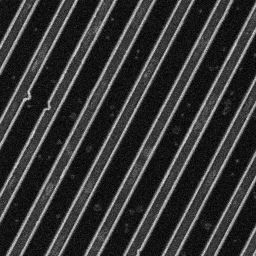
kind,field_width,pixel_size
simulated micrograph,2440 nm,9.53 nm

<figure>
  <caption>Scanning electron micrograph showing parallel lines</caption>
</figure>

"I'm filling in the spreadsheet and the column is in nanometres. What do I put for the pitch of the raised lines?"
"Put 329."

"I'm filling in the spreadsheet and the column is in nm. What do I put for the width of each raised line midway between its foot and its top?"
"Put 223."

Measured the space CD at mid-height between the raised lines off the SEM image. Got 0.108 um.